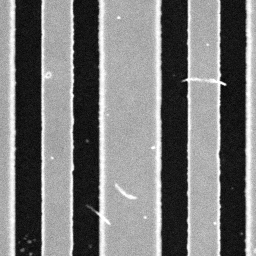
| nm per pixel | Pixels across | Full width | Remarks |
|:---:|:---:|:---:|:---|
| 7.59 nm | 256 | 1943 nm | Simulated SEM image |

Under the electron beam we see lines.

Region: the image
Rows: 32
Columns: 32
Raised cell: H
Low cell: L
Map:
HHLLLHHHHLLLHHHHHHHHLLLLHHHLLLLH
HHLLLHHHHLLLHHHHHHHHLLLLHHHLLLLH
HHLLLHHHHLLLHHHHHHHHLLLLHHHLLLLH
HHLLLHHHHLLLHHHHHHHHLLLHHHHLLLLH
HHLLLHHHHLLLHHHHHHHHLLLLHHHLLLLH
HHLLLHHHHLLLHHHHHHHHLLLHHHHLLLLH
HHLLLHHHHLLLHHHHHHHHLLLLHHHLLLLH
HHLLLHHHHLLLHHHHHHHHLLLLHHHLLLLH
HHLLLHHHHLLLHHHHHHHHLLLLHHHLLLLH
HHLLLHHHHLLLHHHHHHHHLLLHHHHLLLLH
HHLLLHHHHLLLHHHHHHHHLLLHHHHHLLLH
HHLLLHHHHLLLHHHHHHHHLLLHHHHLLLLH
HHLLLHHHHLLLHHHHHHHHLLLHHHHLLLLH
HHLLLHHHHLLLHHHHHHHHLLLLHHHLLLLH
HHLLLHHHHLLLHHHHHHHHLLLLHHHLLLLH
HHLLLHHHHLLLHHHHHHHHLLLLHHHLLLLH
HHLLLHHHHLLLHHHHHHHHLLLLHHHLLLLH
HHLLLHHHHLLLHHHHHHHHLLLLHHHLLLLH
HHLLLHHHHLLLHHHHHHHHLLLHHHHLLLLH
HHLLLHHHHLLLHHHHHHHHLLLHHHHLLLLH
HHLLLHHHHLLLHHHHHHHHLLLLHHHLLLLH
HHLLLHHHHLLLHHHHHHHHLLLHHHHLLLLH
HHLLLHHHHLLLHHHHHHHHLLLHHHHLLLLH
HHLLLHHHHLLLHHHHHHHHLLLHHHHLLLLH
HHLLLHHHHLLLHHHHHHHHLLLHHHHLLLLH
HHLLLHHHHLLLHHHHHHHHLLLLHHHLLLLH
HHLLLHHHHLLLHHHHHHHHLLLLHHHLLLLH
HHLLLHHHHLLLHHHHHHHHLLLHHHHLLLLH
HHLLLHHHHLLLHHHHHHHHLLLHHHHLLLLH
HHLLLHHHHLLLHHHHHHHHLLLLHHHLLLLH
HHLLLHHHHLLLHHHHHHHHLLLHHHHLLLLH
HHLLLHHHHLLLHHHHHHHHLLLHHHHLLLLH